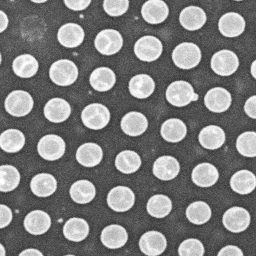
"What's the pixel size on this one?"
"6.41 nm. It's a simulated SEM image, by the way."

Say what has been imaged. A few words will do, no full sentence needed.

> a regular array of raised bodies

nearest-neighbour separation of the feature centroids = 243 nm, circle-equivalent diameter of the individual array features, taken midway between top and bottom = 157 nm